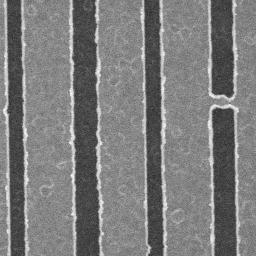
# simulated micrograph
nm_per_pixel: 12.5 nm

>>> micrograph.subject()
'one or a few lines or trenches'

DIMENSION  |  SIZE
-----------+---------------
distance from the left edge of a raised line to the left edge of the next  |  868 nm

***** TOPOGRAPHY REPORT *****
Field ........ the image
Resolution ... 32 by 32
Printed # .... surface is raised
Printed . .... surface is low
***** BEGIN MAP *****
#..######...######..######...###
#..######...######..######...###
#..######...######..######...###
#..######...######..######...###
#..######...######..######...###
#..######...######..######...###
#..######...######..######...###
#..######...######..######...###
#..######...######..######...###
#..######...######..######...###
#..######...######..######...###
#..######...######..######...###
#..######...######..############
#..######...######..#######..###
#..######...######..######...###
#..######...######..######...###
#..######...######..######....##
#..######...######..######...###
#..######...######..######...###
#..######...######..######...###
#..######...######..######....##
#..######...######..######....##
#..######...######..#######..###
#..######...######..#######...##
#..######...######...######...##
#..######....#####...######...##
#..######....#####..#######...##
#..######....#####...######...##
#..######....#####...######...##
#..######....#####...######...##
#..######....#####...######...##
#..######....######..######...##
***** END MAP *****